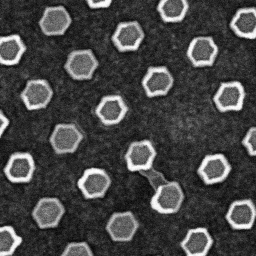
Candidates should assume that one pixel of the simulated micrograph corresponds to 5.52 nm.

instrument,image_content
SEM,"a regular array of raised bodies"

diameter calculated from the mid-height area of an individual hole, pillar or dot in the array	0.159	microns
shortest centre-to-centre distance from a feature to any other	292	nanometers